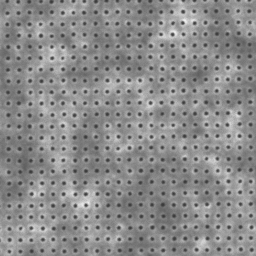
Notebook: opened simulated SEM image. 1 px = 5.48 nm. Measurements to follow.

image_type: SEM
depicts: a regular array of holes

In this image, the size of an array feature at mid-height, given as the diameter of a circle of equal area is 22.3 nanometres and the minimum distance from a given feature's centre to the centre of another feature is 58.5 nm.